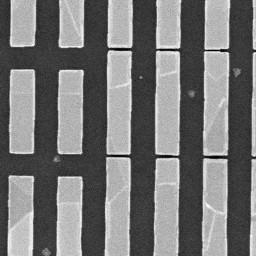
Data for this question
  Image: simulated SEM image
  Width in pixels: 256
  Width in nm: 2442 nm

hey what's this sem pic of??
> wiring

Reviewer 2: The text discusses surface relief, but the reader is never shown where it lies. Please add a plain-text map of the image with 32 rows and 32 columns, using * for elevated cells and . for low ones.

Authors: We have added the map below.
.***....**....**....***...***...
.***....**....**....**....***...
.***....**....**....**....***...
.***....**....**....**....***...
.***...***....**....**....***...
.***...***....**....**....***...
..............**....**....**....
..............**....**....***...
..............**....**....***...
.***...***....**....**....***...
.***...***....**....**....**....
.***...***....**....**....**....
.***...***....**....**....**....
.***...***....**....**....**....
.***...***....**....**....**....
.***...***....**....**....**....
.***...***....**....**...***....
.***...***...***....**...***....
.***...***...***....**...***....
..............**....**....*.....
.............***....**...***....
.............***....**...***....
.***...***...***....**...***....
.***...***...***...***...***...*
.***...***...***...***...***...*
.***...***...***...***...***...*
.***...***...***...***...***...*
.***...***...***...***...***...*
.***...***...***...***...***...*
.***...***...***...***...***...*
.***...***...***...***...***...*
.***...***...***...***...***...*